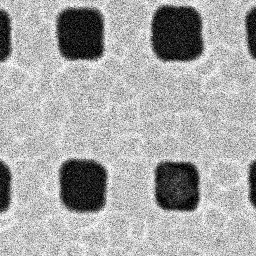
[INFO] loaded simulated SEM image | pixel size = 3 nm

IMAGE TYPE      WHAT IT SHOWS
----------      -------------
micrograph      holes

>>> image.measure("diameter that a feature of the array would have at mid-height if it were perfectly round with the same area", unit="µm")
0.162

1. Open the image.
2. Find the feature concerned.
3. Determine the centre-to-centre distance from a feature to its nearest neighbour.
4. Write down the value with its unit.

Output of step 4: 287 nanometers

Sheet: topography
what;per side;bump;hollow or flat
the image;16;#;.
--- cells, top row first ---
####..####..####
.###..###....##.
.###..###....##.
.###..####..####
################
################
################
################
################
################
####..####..####
.###...###..####
.###...###..####
################
################
################